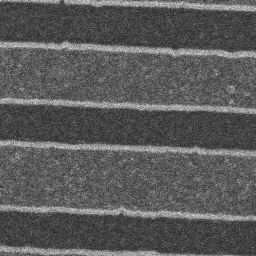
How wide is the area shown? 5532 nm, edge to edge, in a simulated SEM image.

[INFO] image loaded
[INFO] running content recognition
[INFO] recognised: one or a few lines or trenches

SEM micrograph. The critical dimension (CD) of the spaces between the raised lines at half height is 0.904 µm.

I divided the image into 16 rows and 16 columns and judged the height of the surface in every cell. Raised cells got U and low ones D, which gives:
DDDDDDDDDDDDDDDU
DDDDDDDDDDDDDDDD
DDDDDDDDDDDDDDDD
UUUUUUUUUUUUUUUU
UUUUUUUUUUUUUUUU
UUUUUUUUUUUUUUUU
DDDDDUUUUUUUUUUU
DDDDDDDDDDDDDDDD
DDDDDDDDDDDDDDDD
UUUUUUUUUUUUUDDD
UUUUUUUUUUUUUUUU
UUUUUUUUUUUUUUUU
UUUUUUUUUUUUUUUU
DDDDDDDDDDDDUUUU
DDDDDDDDDDDDDDDD
DDDDDDDDDDDDDDDD